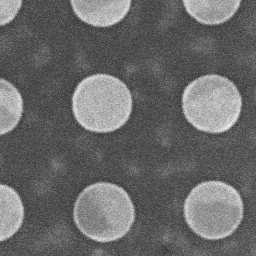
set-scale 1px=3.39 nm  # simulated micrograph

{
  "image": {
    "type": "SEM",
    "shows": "raised bodies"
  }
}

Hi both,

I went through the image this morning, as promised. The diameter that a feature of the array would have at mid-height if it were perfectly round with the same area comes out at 0.195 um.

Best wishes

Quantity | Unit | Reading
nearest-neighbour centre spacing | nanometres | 365